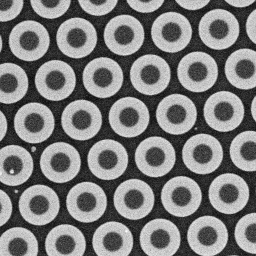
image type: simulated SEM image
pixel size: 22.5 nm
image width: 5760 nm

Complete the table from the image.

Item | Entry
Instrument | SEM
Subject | an array of small figures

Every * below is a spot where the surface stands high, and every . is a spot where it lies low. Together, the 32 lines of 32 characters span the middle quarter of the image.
*.....********...*********...***
**...*********...*********..****
***..**********..*********..****
***..**********..*********...***
***..**********..*********...***
***..*********...*********....**
**....********....*******......*
**.....******.......***.........
...............***.......******.
..*****......*******....********
.*******....********....********
*********...*********..*********
*********..**********..*********
*********..**********..*********
*********..**********..*********
*********...*********...********
*********...********.....******.
.*******......*****........**...
..*****..............****.......
.........****......*******.....*
**.....********....********...**
***....********...**********..**
****..**********..**********..**
****..**********..**********..**
****..**********..**********..**
****..**********..*********....*
****...********....********.....
***....********.....*****.......
**.......****..............****.
...............*****......******
...*****......*******....*******
..********...*********...*******